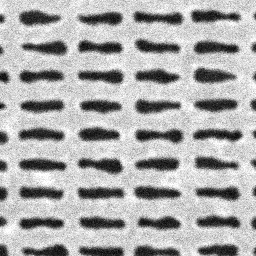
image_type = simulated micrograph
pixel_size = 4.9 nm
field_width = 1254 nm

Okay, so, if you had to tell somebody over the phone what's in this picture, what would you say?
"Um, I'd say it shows a regular array of holes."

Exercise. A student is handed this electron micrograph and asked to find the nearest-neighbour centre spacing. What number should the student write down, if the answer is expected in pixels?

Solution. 28.8